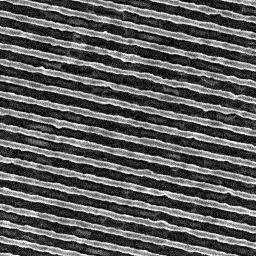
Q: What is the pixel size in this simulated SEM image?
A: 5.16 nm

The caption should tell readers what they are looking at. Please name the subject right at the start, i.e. parallel lines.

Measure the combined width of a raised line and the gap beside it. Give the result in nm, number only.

81.3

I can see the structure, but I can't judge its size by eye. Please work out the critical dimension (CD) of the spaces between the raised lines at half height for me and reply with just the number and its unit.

54.8 nanometres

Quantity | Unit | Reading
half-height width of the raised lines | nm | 29.6